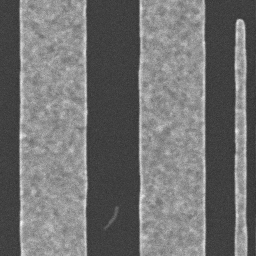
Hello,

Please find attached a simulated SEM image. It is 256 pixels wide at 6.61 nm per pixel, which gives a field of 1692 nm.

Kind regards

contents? wiring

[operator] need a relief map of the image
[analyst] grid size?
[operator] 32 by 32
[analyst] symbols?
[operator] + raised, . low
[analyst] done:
...++++++++.......++++++++......
...++++++++.......++++++++......
...++++++++.......++++++++......
...++++++++.......+++++++.....+.
...++++++++.......+++++++.....+.
...++++++++.......++++++++...++.
...++++++++.......++++++++...++.
...++++++++.......++++++++...++.
...++++++++......+++++++++...++.
...++++++++......+++++++++...++.
...++++++++......+++++++++...++.
...++++++++......+++++++++....+.
...++++++++.......++++++++....+.
...++++++++.......++++++++...++.
...++++++++.......++++++++...++.
...++++++++.......++++++++...++.
...++++++++.......++++++++...++.
...++++++++.......++++++++...++.
...++++++++.......++++++++....+.
...++++++++.......++++++++...++.
...++++++++.......++++++++...++.
...++++++++.......++++++++...++.
...++++++++.......++++++++...++.
...++++++++.......++++++++...++.
...++++++++.......++++++++...++.
...++++++++.......++++++++...++.
...++++++++.......++++++++....+.
...++++++++.......++++++++....+.
...++++++++.......++++++++...++.
...++++++++.......++++++++...++.
...++++++++.......++++++++...++.
...++++++++.......++++++++...++.